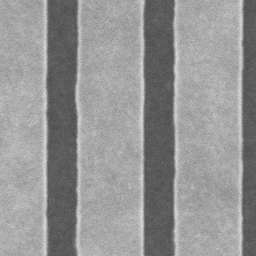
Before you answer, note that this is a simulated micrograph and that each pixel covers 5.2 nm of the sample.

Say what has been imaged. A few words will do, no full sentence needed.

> lines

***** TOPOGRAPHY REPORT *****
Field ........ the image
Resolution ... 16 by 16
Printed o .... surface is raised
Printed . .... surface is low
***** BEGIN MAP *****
ooo..oooo..oooo.
ooo..oooo..oooo.
ooo..oooo..oooo.
ooo..oooo..oooo.
ooo..oooo..oooo.
ooo..oooo..oooo.
ooo..oooo..oooo.
ooo..oooo..oooo.
ooo..oooo..oooo.
ooo..oooo..oooo.
ooo..oooo..oooo.
ooo..oooo..oooo.
ooo..oooo..oooo.
ooo..oooo..oooo.
ooo..oooo..oooo.
ooo..oooo..oooo.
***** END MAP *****